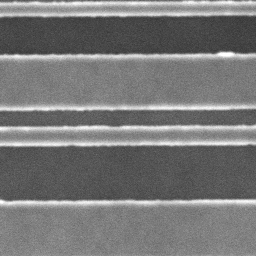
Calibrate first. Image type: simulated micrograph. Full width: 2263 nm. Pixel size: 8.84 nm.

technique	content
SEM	lines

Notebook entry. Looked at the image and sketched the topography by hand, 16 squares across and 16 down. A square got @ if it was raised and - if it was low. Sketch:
@@@@@@@@@@@@@@@@
----------------
----------------
@@@@@@@@@@@@@@@@
@@@@@@@@@@@@@@@@
@@@@@@@@@@@@@@@@
@@@@@@@@@@@@@@@@
@@@@@@@@@@@@@@@@
@@@@@@@@@@@@@@@@
----------------
----------------
----------------
----------------
@@@@@@@@@@@@@@@@
@@@@@@@@@@@@@@@@
@@@@@@@@@@@@@@@@